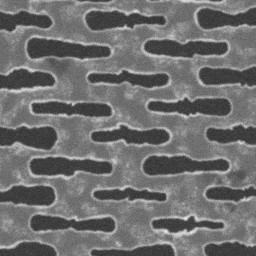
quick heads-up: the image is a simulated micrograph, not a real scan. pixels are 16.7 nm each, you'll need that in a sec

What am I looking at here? a regular array of holes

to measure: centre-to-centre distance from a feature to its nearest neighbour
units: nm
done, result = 976